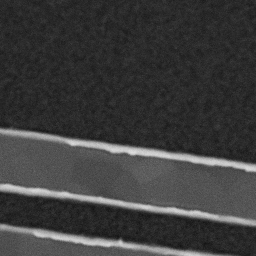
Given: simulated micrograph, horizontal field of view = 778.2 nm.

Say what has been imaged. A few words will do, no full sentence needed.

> one or a few lines or trenches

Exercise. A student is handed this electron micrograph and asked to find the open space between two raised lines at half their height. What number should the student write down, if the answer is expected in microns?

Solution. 0.112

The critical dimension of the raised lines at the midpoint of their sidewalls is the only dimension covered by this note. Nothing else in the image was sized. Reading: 176 nm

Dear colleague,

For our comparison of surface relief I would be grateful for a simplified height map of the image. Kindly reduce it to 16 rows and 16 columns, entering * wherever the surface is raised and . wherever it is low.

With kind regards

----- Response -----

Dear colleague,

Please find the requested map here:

................
................
................
................
................
................
................
................
***.............
**********......
****************
****************
.....***********
............****
***.............
**********......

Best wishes